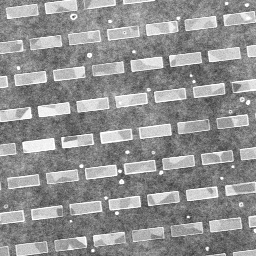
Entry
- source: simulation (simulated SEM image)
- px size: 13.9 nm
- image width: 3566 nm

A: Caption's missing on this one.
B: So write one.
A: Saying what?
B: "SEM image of an array of small figures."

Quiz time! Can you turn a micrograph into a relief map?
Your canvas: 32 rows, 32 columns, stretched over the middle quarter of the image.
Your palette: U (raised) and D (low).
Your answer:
DDDDDDDUUUUUUUUDDUUUUUUUUDDUDDDD
UUUUUDDUUUUUUUUDDUUUDDDDDDDDDDDD
UUUUUDDUUUUDDDDDDDDDDDDDDDDDDDDD
UUUDDDDDDDDDDDDDDDDDDDDDDDDDDDDD
DDDDDDDDDDDDDDDDDDDDDDDDDDDDDDDD
DDDDDDDDDDDDDDDDDDDDDDDDDDDDDDDD
DDDDDDDDDDDDDDDDDDDDDDDDDDDDUUDD
DDDDDDDDDDDDDDDDDDDDDDDUUUUUUUDD
DDDDDDDDDDDDDUUUUUUUUDDUUUUUUUDD
DDDUUUUUUUUDDUUUUUUUUDDDDDDDDDDD
UDDUUUUUUUUDDUUDDDDDDDDDDDDDDDDD
UDDDUUUUDDDDDDDDDDDDDDDDDDDDDDDD
DDDDDDDDDDDDDDDDDDDDDDDDDDDDDDDD
DDDDDDDDDDDDDDDDDDDDDDDDDDDDDDDD
DDDDDDDDDDDDDDDDDDDDDDDDDDDDDDDU
DDDDDDDDDDDDDDDDDDDDDDDUUUUDDUUU
DDDDDDDDDDDDDDDUDDDUUUUUUUUDDUUU
DDDDDDDDDUUUUUUUUDDUUUUUUUUDDDDD
UUUUUUUDDUUUUUUUUDDDDDDDDDDDDDDD
UUUUUUUDDDUDDDDDDDDDDDDDDDDDDDDD
UUUUDDDDDDDDDDDDDDDDDDDDDDDDDDDD
DDDDDDDDDDDDDDDDDDDDDDDDDDDDDDDD
DDDDDDDDDDDDDDDDDDDDDDDDDDDDDDDD
DDDDDDDDDDDDDDDDDDDDDDDDDDDUUUUU
DDDDDDDDDDDDDDDDDDDDUUDDDUUUUUUU
DDDDDDDDDDDDUDDUUUUUUUUDDUUUUUUU
DDDDDUUUUUUUUDDUUUUUUUUDDDDDDDDD
UUUDDDUUUUUUUDDDDDDDDDDDDDDDDDDD
UUUDDDUUDDDDDDDDDDDDDDDDDDDDDDDD
DDDDDDDDDDDDDDUDDDDDDDDDDDDDDDDD
DDDDDDDDDDDDDDDDDDDDDDDDDDDDDDDD
DDDDDDDDDDDDDDDDDDDDDDDDDDDDDDDD